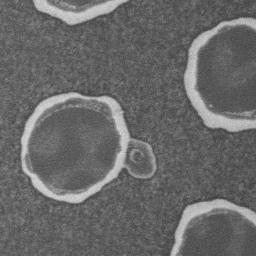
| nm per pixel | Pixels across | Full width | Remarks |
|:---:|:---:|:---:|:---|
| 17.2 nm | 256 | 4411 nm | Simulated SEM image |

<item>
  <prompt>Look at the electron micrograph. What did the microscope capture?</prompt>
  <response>raised bodies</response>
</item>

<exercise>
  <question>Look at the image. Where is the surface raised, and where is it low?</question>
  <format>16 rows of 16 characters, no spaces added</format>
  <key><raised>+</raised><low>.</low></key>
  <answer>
...++++.........
..............++
.............+++
............++++
............++++
............++++
...++++.....++++
..+++++......+++
..++++++........
.+++++++........
..+++++.........
..++++..........
................
............++++
...........+++++
...........+++++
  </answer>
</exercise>